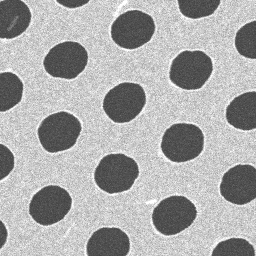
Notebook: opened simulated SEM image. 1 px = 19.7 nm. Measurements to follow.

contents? a regular array of holes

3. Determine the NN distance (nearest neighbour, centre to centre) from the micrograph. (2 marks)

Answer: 1390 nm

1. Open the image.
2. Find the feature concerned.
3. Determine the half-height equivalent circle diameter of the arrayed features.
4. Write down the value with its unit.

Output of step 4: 823 nm